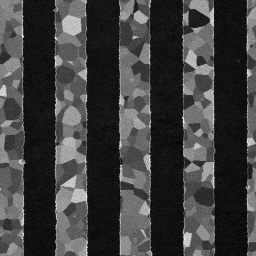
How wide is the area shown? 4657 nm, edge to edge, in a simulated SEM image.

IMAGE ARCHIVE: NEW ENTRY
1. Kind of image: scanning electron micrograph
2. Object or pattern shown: one or a few lines or trenches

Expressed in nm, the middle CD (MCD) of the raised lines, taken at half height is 553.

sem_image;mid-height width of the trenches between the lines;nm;608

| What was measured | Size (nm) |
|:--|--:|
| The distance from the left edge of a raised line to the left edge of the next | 1160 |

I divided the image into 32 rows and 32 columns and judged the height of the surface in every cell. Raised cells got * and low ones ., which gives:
***....****....****....****....*
***....****....****....****....*
***....****....****....****....*
***....****....****....****....*
***....****....****....****....*
***....****....****....****....*
***....****....****....****....*
***....****....****....****....*
***....****....****....****....*
***....****....****....****....*
***....****....****....****....*
***....****....****....****....*
***....****....****....****....*
***....****....****....****....*
***....****....****....****....*
***....****....****....****....*
***....****....****....****....*
***....****....****....****....*
***....****....****....****....*
***....****....****....****....*
***....****....****....****....*
***....****....****....****....*
***....****....****....****....*
***....****....****....****....*
***....****....****....****....*
***....****....****....****....*
***....****....****....****....*
***....****....****....****....*
***....****....****....****....*
***....****....****....****....*
***....****....****....****....*
***....****....****....****....*